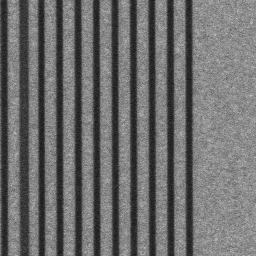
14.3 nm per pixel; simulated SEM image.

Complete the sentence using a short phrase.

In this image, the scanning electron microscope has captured parallel lines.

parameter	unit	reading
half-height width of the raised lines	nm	185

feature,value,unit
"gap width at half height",80.6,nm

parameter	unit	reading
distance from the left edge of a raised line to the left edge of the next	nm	265